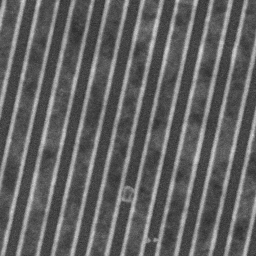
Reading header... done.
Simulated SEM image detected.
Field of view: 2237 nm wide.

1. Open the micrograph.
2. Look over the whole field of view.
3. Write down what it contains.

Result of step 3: parallel lines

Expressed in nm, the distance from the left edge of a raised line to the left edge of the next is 295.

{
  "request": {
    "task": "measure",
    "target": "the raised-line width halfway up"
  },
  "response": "171 nm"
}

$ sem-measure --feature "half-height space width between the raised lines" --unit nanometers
126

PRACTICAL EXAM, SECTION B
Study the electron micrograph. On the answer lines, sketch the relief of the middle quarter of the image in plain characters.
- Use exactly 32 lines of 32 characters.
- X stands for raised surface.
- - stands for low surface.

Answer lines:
XXXX---XXXXX----XXXXX----XXXXX--
XXXX---XXXXX----XXXXX---XXXXX---
XXX----XXXXX----XXXX----XXXXX---
XXX----XXXXX---XXXXX----XXXXX---
XXX----XXXX----XXXXX----XXXXX---
XXX---XXXXX----XXXXX----XXXX----
XX----XXXXX----XXXXX---XXXXX----
XX----XXXXX----XXXX----XXXXX----
XX----XXXX----XXXXX----XXXXX----
XX---XXXXX----XXXXX----XXXXX---X
XX---XXXXX----XXXXX----XXXX----X
X----XXXXX----XXXXX---XXXXX----X
X----XXXXX----XXXX----XXXXX----X
X----XXXX----XXXXX----XXXXX----X
X---XXXXX----XXXXX----XXXXX---XX
----XXXXX----XXXXX---XXXXX----XX
----XXXXX----XXXX----XXXXX----XX
----XXXXX----XXXX----XXXXX----XX
---XXXXX----XXXXX----XXXXX----XX
---XXXXX----XXXXX----XXXXX---XXX
---XXXXX----XXXXX---XXXXX----XXX
---XXXXX----XXXX----XXXXX----XXX
---XXXX----XXXXX----XXXXX----XXX
--XXXXX----XXXXX----XXXXX---XXXX
--XXXXX----XXXXX----XXXX----XXXX
--XXXXX----XXXXX---XXXXX----XXXX
--XXXXX----XXXX----XXXXX----XXXX
-XXXXX----XXXXX----XXXXX----XXXX
-XXXXX----XXXXX----XXXXX---XXXXX
-XXXXX----XXXXX---XXXXX----XXXXX
-XXXXX----XXXX----XXXXX----XXXXX
-XXXXX----XXXX----XXXXX----XXXXX